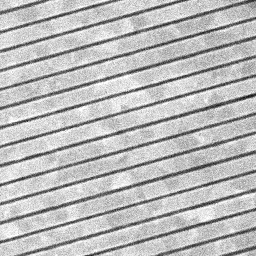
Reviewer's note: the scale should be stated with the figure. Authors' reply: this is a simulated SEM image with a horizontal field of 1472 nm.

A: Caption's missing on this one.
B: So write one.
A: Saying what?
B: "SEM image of parallel lines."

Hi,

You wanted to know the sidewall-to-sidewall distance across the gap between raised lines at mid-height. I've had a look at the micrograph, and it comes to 25.6 nanometers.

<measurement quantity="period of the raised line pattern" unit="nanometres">106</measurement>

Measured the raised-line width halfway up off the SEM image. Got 14.2 px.